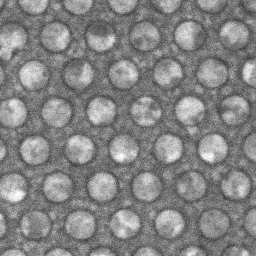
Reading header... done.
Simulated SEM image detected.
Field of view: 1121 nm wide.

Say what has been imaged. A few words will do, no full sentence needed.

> a regular array of raised bodies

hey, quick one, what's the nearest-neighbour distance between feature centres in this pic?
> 190 nanometres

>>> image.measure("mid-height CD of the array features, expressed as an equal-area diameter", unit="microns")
0.123